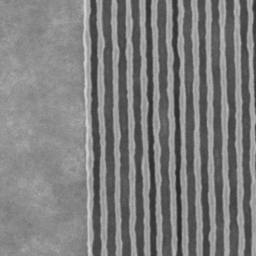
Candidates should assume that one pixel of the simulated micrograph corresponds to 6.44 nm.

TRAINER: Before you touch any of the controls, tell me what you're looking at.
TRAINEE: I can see parallel lines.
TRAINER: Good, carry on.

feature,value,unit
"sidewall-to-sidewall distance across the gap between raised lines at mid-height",54.7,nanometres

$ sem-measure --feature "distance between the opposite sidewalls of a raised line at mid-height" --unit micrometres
0.0362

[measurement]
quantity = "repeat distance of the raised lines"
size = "87.7 nm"